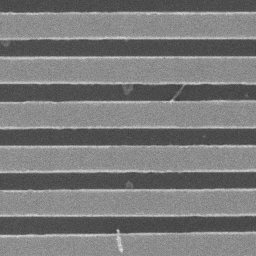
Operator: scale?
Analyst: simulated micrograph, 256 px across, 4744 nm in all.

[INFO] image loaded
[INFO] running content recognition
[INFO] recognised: lines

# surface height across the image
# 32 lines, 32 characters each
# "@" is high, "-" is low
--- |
--------------------------------
--------------------------------
@@@@@@@@@@@@@@@@@@@@@@@@@@@@@@@@
@@@@@@@@@@@@@@@@@@@@@@@@@@@@@@@@
@@@@@@@@@@@@@@@@@@@@@@@@@@@@@@@@
--------------------------------
--------------------------------
@@@@@@@@@@@@@@@@@@@@@@@@@@@@@@@@
@@@@@@@@@@@@@@@@@@@@@@@@@@@@@@@@
@@@@@@@@@@@@@@@@@@@@@@@@@@@@@@@@
--------------@@--@@@-@@@@@@@-@@
--------------------------------
--------------------------------
@@@@@@@@@@@@@@@@@@@@@@@@@@@@@@@@
@@@@@@@@@@@@@@@@@@@@@@@@@@@@@@@@
@@@@@@@@@@@@@@@@@@@@@@@@@@@@@@@@
--------------------------------
--------------------------------
@@@@@@@@@@@@@@@@@@@@@@@@@@@@@@@@
@@@@@@@@@@@@@@@@@@@@@@@@@@@@@@@@
@@@@@@@@@@@@@@@@@@@@@@@@@@@@@@@@
@@@@@@@@@-@@---@--@-@-----------
--------------------------------
--------------------------------
@@@@@@@@@@@@@@@@@@@@@@@@@@@@@@@@
@@@@@@@@@@@@@@@@@@@@@@@@@@@@@@@@
@@@@@@@@@@@@@@@@@@@@@@@@@@@@@@@@
--------------------------------
--------------------------------
@@@@@@@@@@@@@@@@@@@@@@@@@@@@@@@@
@@@@@@@@@@@@@@@@@@@@@@@@@@@@@@@@
@@@@@@@@@@@@@@@@@@@@@@@@@@@@@@@@